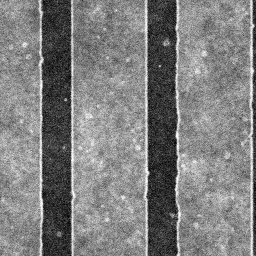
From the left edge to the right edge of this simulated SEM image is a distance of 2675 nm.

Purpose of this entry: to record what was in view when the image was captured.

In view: one or a few lines or trenches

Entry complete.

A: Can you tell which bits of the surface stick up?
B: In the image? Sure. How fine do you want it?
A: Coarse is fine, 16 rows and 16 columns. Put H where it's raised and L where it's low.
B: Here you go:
HHHLLHHHHLLHHHHH
HHHLLHHHHLLHHHHH
HHHLLHHHHLLHHHHH
HHHLLHHHHLLHHHHH
HHHLLHHHHLLHHHHH
HHHLLHHHHLLHHHHH
HHHLLHHHHLLHHHHH
HHHLLHHHHLLHHHHH
HHHLLHHHHLLHHHHH
HHHLLHHHHLLHHHHH
HHHLLHHHHLLHHHHH
HHHLLHHHHLLHHHHH
HHHLLHHHHLLHHHHH
HHHLLHHHHLLHHHHH
HHHLLHHHHLLHHHHH
HHHLLHHHHLLHHHHH